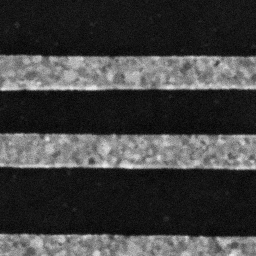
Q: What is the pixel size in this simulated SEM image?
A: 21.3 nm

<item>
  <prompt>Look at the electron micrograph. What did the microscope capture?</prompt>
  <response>lines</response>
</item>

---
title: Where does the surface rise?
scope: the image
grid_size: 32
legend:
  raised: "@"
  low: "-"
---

--------------------------------
--------------------------------
--------------------------------
--------------------------------
--------------------------------
--------------------------------
--------------------------------
@@@@@@@@@@@@@@@@@@@@@@@@@@@@@@@@
@@@@@@@@@@@@@@@@@@@@@@@@@@@@@@@@
@@@@@@@@@@@@@@@@@@@@@@@@@@@@@@@@
@@@@@@@@@@@@@@@@@@@@@@@@@@@@@@@@
--------------------------------
--------------------------------
--------------------------------
--------------------------------
--------------------------------
--------------------------------
@@@@@@@@@@@@@@@@@@@@@@@@@@@@@@@@
@@@@@@@@@@@@@@@@@@@@@@@@@@@@@@@@
@@@@@@@@@@@@@@@@@@@@@@@@@@@@@@@@
@@@@@@@@@@@@@@@@@@@@@@@@@@@@@@@@
--------------------------------
--------------------------------
--------------------------------
--------------------------------
--------------------------------
--------------------------------
--------------------------------
--------------------------------
@@@@@@@@@@@@@-------------------
@@@@@@@@@@@@@@@@@@@@@@@@@@@@@@@@
@@@@@@@@@@@@@@@@@@@@@@@@@@@@@@@@